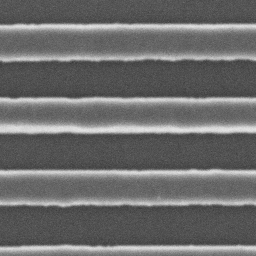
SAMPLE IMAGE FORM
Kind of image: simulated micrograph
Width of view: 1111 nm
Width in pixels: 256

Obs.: lines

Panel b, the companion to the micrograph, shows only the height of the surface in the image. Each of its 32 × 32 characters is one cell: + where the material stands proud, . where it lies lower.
................................
................................
................................
++++++++++++++++++++++++++++++++
++++++++++++++++++++++++++++++++
++++++++++++++++++++++++++++++++
++++++++++++++++++++++++++++++++
++++++.++..++..++....+..........
................................
................................
................................
................................
++++++++++++++++++++++++++++++++
++++++++++++++++++++++++++++++++
++++++++++++++++++++++++++++++++
++++++++++++++++++++++++++++++++
................................
................................
................................
................................
................................
.+++++++++++++++..++++++++++++++
++++++++++++++++++++++++++++++++
++++++++++++++++++++++++++++++++
++++++++++++++++++++++++++++++++
++++++++++++++++++++++++.+++++++
................................
................................
................................
................................
................................
++++++++++++++++++++++++++++++++